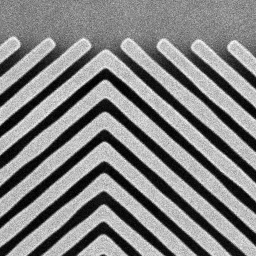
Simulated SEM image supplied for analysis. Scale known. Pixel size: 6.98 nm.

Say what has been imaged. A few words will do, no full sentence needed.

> groups of lines, slits or small figures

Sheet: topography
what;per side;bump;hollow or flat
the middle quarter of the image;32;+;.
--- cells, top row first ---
+....+++++++++++...+++++....++++
....+++++..+++++....+++++....+++
...+++++.....+++++....++++....++
..+++++.......+++++...+++++....+
.+++++...++....+++++....+++++...
++++....++++....+++++....+++++..
+++....++++++....+++++....+++++.
++....++++++++....+++++....+++++
+....+++++++++++...+++++....++++
....+++++...+++++....++++....+++
..++++++.....+++++....+++++...++
.+++++........+++++....+++++...+
+++++....++....+++++....+++++...
++++....++++....+++++....+++++..
+++....+++++++...+++++....+++++.
++....+++++++++...+++++....+++++
....+++++..+++++....+++++...++++
...+++++....+++++....++++....+++
..+++++......+++++....+++++...++
.+++++........+++++....+++++...+
+++++...++++...+++++....+++++...
++++...++++++....++++....+++++..
++....++++++++....++++....+++++.
+....++++++++++....+++++...+++++
....+++++..+++++....+++++....+++
...+++++....+++++....+++++....++
..+++++......+++++....+++++....+
++++++...++...+++++....+++++....
++++....++++...+++++....+++++...
+++....++++++....+++++....++++..
++....++++++++....++++.....++++.
+....++++++++++....+++++....++++